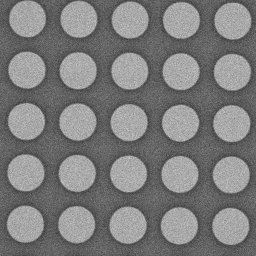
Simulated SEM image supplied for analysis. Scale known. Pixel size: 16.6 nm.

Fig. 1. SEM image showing an array of small figures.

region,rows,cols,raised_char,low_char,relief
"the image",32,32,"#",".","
..###....##....##.....##....##..
.#####..####..####...####..####.
.#####..####..####..#####..####.
..###...####..####...####..####.
...#.....##....##.....##....##..
................................
................................
..###...####..####...###...####.
.#####..####..####..#####..####.
.#####..####..####..#####..####.
..###...###....###...###...####.
................................
................................
..###...###....##....###....##..
.####...####..####...####..####.
.#####..####..####..#####..####.
.####...####..####...####..####.
................#.....#.....##..
................................
..##.....#......................
.####...####..####...###...####.
.####..#####..####..#####..####.
.####...####..####..#####..####.
..##....###....##....###...###..
................................
................................
..###...###...####...###...###..
.####..#####..####..#####..####.
.####..#####..####..#####..####.
.####...###...####...###...####.
............................#...
................................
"